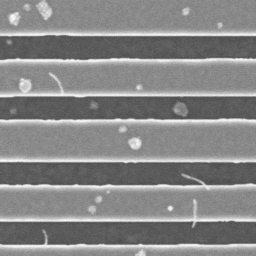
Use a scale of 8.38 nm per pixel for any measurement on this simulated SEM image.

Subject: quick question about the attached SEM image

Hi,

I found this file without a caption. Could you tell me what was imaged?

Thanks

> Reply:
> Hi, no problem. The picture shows lines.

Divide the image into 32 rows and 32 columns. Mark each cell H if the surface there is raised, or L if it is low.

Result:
HHHHHHHHHHHHHHHHHHHHHHHHHHHHHHHH
HHHHHHHHHHHHHHHHHHHHHHHHHHHHHHHH
HHHHHHHHHHHHHHHHHHHHHHHHHHHHHHHH
HHHHHHHHHHHHHHHHHHHHHHHHHHHHHHHH
LLLLLLLLLLLLLLLLLLLLLLLLLLLLLLLL
LLLLLLLLLLLLLLLLLLLLLLLLLLLLLLLL
LLLLLLLLLLLLLLLLLLLLLLLLLLLLLLLL
HHHHHHHHLHLHHHHHHHHHHHHHHHHHHHHH
HHHHHHHHHHHHHHHHHHHHHHHHHHHHHHHH
HHHHHHHHHHHHHHHHHHHHHHHHHHHHHHHH
HHHHHHHHHHHHHHHHHHHHHHHHHHHHHHHH
HHHHHHHHHHHHHHHHHHHHHHHHHHHHHHHH
LLLLLLLLLLLLLLLLLLLLLLLLLLLLLLLL
LLLLLLLLLLLLLLLLLLLLLLLLLLLLLLLL
LLLLLLLLLLLLLLLLLLLLLLLLLLLLLLLL
HHHHHHHHHHHHHHHHHHHHHHHHHHHHHHHH
HHHHHHHHHHHHHHHHHHHHHHHHHHHHHHHH
HHHHHHHHHHHHHHHHHHHHHHHHHHHHHHHH
HHHHHHHHHHHHHHHHHHHHHHHHHHHHHHHH
HHHHHHHHHHHHHHHHHHHHHHHHHHHHHHHH
LLLLLLLLLLLLLLLLLLLLLLLLLLLLLLLL
LLLLLLLLLLLLLLLLLLLLLLLLLLLLLLLL
LLLLLLLLLLLLLLLLLLLLLLLLLLLLLLLL
HHHHHHHHHHHHHHHHHHHHHHHHHHHHHHHH
HHHHHHHHHHHHHHHHHHHHHHHHHHHHHHHH
HHHHHHHHHHHHHHHHHHHHHHHHHHHHHHHH
HHHHHHHHHHHHHHHHHHHHHHHHHHHHHHHH
HHHHHHHHHHHHHHHHHHHHHHHHHHHHHHHH
LLLLLLLLLLLLLLLLLLLLLLLLLLLLLLLL
LLLLLLLLLLLLLLLLLLLLLLLLLLLLLLLL
LLLLLLLLLLLLLLLLLLLLLLLLLLLLLLLL
HHHHHHHHHHHHHHHHHHHHHHHHHHHHHHHH